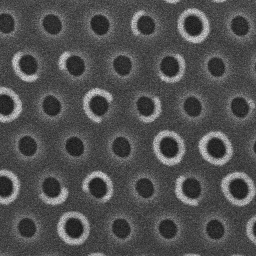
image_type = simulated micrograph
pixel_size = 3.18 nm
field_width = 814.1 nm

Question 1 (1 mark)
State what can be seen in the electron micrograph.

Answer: a regular array of holes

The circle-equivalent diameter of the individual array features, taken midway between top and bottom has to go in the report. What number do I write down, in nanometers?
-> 62.4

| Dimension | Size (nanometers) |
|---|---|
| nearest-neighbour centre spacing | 148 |